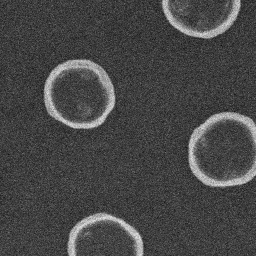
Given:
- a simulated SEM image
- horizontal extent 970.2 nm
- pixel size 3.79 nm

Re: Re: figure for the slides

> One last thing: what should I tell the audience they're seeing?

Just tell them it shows raised bodies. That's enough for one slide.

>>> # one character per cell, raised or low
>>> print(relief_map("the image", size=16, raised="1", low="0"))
0000000000111110
0000000000011100
0000000000000000
0000000000000000
0000110000000000
0001111000000000
0001111000000000
0000110000000110
0000000000001111
0000000000001111
0000000000001111
0000000000000000
0000000000000000
0000000000000000
0000011100000000
0000111110000000